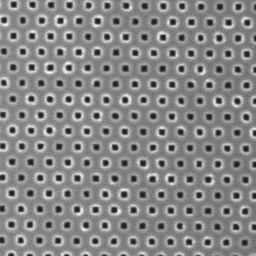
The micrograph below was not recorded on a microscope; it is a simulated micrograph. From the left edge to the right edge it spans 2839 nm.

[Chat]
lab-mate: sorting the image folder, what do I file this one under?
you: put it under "a regular array of holes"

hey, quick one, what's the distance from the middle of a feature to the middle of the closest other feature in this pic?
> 0.198 microns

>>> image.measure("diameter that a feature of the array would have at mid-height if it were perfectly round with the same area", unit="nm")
82